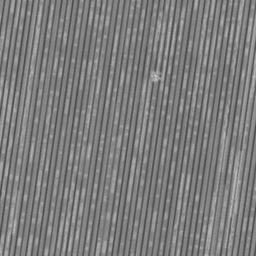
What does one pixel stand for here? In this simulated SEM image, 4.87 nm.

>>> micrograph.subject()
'parallel lines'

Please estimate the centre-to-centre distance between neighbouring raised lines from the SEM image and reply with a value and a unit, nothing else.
27.6 nanometres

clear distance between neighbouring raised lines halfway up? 0.0084 microns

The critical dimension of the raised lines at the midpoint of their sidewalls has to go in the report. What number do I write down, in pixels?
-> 4.33